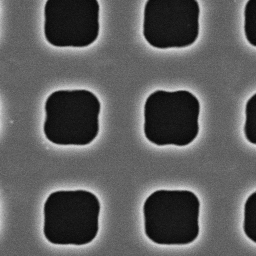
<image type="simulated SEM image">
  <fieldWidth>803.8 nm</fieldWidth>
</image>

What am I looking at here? holes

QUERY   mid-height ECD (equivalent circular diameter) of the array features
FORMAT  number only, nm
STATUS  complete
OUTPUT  184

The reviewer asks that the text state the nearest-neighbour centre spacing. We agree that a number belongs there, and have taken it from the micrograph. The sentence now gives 312 nm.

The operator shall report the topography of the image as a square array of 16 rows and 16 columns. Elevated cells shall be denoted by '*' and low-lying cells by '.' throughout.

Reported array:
***...***...***.
***...***...***.
***...***...****
****************
****************
****************
***...***...***.
***...***...***.
***...***...***.
****************
****************
****************
***...***...***.
***...***...***.
***...***...***.
****************